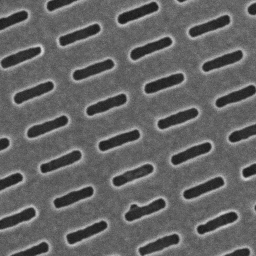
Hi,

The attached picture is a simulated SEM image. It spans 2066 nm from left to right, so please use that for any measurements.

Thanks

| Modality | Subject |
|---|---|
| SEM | a regular array of holes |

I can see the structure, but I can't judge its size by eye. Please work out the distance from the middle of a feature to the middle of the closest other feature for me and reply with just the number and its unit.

301 nanometers